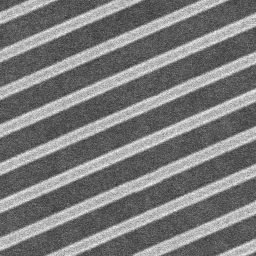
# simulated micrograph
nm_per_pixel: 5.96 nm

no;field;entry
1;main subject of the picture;parallel lines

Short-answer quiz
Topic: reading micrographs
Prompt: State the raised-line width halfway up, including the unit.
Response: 62.1 nanometers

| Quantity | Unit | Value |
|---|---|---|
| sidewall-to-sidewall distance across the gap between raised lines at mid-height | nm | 139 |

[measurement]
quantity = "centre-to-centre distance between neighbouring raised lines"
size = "0.205 µm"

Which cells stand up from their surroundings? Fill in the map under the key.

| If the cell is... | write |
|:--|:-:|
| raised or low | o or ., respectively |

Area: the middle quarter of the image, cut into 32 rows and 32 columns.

ooo...............ooooooo.......
o...............oooooo..........
..............oooooo............
...........ooooooo..............
.........ooooooo...............o
.......oooooo................ooo
.....oooooo...............oooooo
..ooooooo...............oooooo..
oooooo................oooooo....
oooo...............ooooooo......
oo...............oooooo.........
...............oooooo...........
.............oooooo.............
..........ooooooo..............o
........oooooo...............ooo
......oooooo...............ooooo
...ooooooo..............ooooooo.
.oooooo...............ooooooo...
ooooo...............ooooooo.....
ooo...............oooooo........
o..............ooooooo..........
.............ooooooo............
...........ooooooo..............
........ooooooo...............oo
......ooooooo...............oooo
....ooooooo..............ooooooo
..oooooo...............ooooooo..
oooooo...............ooooooo....
oooo...............oooooo.......
oo..............oooooooo........
..............ooooooo...........
............ooooooo.............